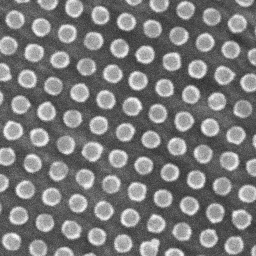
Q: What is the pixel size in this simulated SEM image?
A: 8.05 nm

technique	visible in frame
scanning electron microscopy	a regular array of raised bodies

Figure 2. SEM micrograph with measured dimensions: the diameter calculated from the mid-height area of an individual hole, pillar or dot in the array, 141 nm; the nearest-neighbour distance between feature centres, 26.5 pixels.